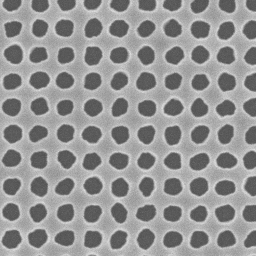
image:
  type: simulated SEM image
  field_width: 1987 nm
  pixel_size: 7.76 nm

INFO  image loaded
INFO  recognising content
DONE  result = a regular array of holes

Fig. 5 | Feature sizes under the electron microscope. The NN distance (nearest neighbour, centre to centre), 199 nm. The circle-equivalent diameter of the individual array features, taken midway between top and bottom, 142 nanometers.